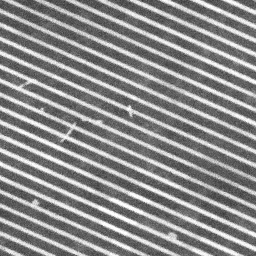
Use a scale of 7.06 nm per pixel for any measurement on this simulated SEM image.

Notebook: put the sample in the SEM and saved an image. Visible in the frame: parallel lines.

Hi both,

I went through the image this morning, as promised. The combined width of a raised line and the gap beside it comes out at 89.6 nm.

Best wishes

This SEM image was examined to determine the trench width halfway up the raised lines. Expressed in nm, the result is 73.4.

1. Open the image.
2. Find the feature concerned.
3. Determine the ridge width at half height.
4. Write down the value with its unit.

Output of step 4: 0.017 um